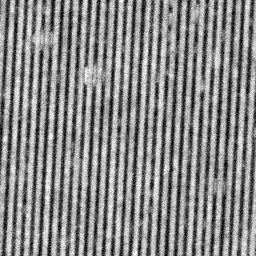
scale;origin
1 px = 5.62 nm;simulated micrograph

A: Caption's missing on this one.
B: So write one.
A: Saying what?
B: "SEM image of parallel lines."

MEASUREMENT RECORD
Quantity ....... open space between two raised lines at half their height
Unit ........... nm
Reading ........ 33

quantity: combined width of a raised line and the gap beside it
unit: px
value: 9.04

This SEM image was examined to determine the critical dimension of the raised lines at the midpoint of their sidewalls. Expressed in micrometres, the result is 0.0189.